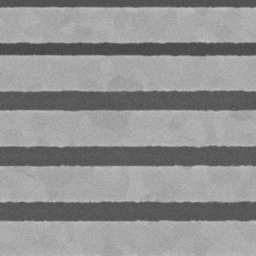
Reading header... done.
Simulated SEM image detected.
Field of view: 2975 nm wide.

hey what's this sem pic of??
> lines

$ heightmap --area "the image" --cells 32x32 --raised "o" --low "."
................................
oooooooooooooooooooooooooooooooo
oooooooooooooooooooooooooooooooo
oooooooooooooooooooooooooooooooo
oooooooooooooooooooooooooooooooo
................................
................................
oooooooooooooooooooooooooooooooo
oooooooooooooooooooooooooooooooo
oooooooooooooooooooooooooooooooo
oooooooooooooooooooooooooooooooo
................................
................................
................................
oooooooooooooooooooooooooooooooo
oooooooooooooooooooooooooooooooo
oooooooooooooooooooooooooooooooo
oooooooooooooooooooooooooooooooo
................................
................................
................................
oooooooooooooooooooooooooooooooo
oooooooooooooooooooooooooooooooo
oooooooooooooooooooooooooooooooo
oooooooooooooooooooooooooooooooo
................................
................................
................................
oooooooooooooooooooooooooooooooo
oooooooooooooooooooooooooooooooo
oooooooooooooooooooooooooooooooo
oooooooooooooooooooooooooooooooo